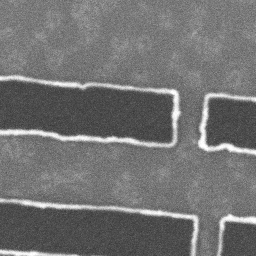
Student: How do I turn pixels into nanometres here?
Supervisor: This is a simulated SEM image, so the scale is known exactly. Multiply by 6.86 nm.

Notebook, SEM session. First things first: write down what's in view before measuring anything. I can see one or a few lines or trenches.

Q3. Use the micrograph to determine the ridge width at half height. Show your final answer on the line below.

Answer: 376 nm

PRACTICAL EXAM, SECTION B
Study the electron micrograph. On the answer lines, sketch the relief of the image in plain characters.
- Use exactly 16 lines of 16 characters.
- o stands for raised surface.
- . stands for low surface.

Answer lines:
................
................
................
................
................
oooooooo........
ooooooooooo..ooo
ooooooooooo..ooo
...oooooooo..ooo
...............o
................
................
................
oooooooooooo....
oooooooooooo..oo
oooooooooooo..oo